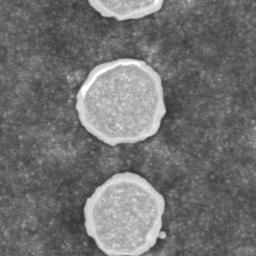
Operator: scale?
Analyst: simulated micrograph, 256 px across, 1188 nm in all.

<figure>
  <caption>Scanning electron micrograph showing raised bodies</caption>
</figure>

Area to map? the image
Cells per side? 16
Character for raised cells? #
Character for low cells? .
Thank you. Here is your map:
......####......
................
................
................
......####......
.....#####......
.....#####......
.....#####......
......###.......
................
................
.......##.......
......####......
.....#####......
......####......
......###.......